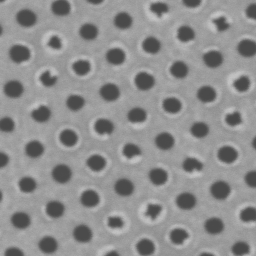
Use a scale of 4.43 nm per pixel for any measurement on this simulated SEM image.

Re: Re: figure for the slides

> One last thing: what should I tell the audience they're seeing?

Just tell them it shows a regular array of holes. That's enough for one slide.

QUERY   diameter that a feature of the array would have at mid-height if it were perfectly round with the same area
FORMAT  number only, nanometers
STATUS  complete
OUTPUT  78.2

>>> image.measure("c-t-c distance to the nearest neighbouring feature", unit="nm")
158